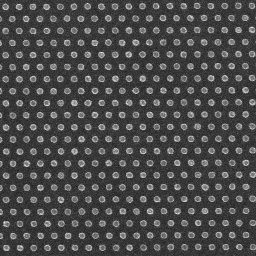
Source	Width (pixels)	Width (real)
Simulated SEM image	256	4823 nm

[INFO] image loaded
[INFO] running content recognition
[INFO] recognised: a regular array of raised bodies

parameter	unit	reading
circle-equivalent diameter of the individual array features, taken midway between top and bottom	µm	0.115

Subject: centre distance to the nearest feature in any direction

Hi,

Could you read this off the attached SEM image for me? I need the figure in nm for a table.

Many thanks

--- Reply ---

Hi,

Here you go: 255